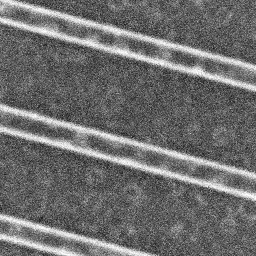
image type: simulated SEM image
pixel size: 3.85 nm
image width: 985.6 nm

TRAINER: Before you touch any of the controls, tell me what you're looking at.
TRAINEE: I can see one or a few lines or trenches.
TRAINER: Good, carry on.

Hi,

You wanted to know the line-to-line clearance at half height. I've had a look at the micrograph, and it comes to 318 nanometres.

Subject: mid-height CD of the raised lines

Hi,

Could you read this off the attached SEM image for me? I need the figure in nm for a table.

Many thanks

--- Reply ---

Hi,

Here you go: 86.5